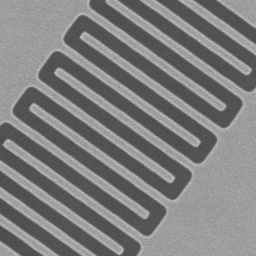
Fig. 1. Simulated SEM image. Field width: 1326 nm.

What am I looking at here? groups of lines, slits or small figures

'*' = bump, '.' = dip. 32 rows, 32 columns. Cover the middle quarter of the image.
....****......***......****.....
......***......****......***....
*......****.....****......***...
***......***......***.......***.
.***......****......***......***
..****.....****......***......**
...****......***......****......
.....***......****......***.....
......****......***......****...
**.....****......****.....****..
***......***......****......***.
.***......****......***......***
..****......***......***......**
....***......****......***......
.....****......***......****....
*.....****......****.....****...
**......***......****......***..
****.....****......***......****
.****......***......****......**
..****......***......****......*
....***......****......***......
.....****......***......****....
*......***......****......***...
**......****......***......****.
****......***......****......***
.****......****.....****......**
...***......****......***......*
....****......****.....****.....
......***......****......***....
*......****......***......*....*
**......****......***..........*
.***......****......***.......**